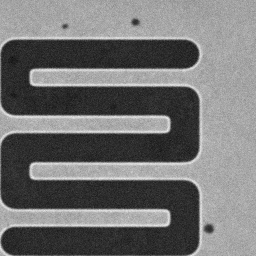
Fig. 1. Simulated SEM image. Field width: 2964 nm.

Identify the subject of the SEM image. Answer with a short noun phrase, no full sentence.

groups of lines, slits or small figures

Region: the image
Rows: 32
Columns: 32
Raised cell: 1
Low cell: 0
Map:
11111111111111111111111111111111
11111111111111111111111111111111
11111111111111111111111111111111
11111111111111111111111111111111
11111111111111111111111111111111
10000000000000000000000011111111
00000000000000000000000001111111
00000000000000000000000001111111
00000000000000000000000011111111
00001111111111111111111111111111
00001111111111111111111111111111
00000000000000000000000001111111
00000000000000000000000001111111
00000000000000000000000001111111
11000000000000000000000001111111
11111111111111111111100001111111
11111111111111111111100001111111
00000000000000000000000001111111
00000000000000000000000001111111
00000000000000000000000001111111
00001111111111111111111111111111
00001111111111111111111111111111
00000000000000000000000111111111
00000000000000000000000001111111
00000000000000000000000001111111
00000000000000000000000001111111
11111111111111111111100001111111
11111111111111111111100001111111
10000000000000000000000001111111
00000000000000000000000001111111
00000000000000000000000001111111
10000000000000000000000011111111